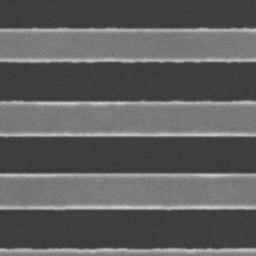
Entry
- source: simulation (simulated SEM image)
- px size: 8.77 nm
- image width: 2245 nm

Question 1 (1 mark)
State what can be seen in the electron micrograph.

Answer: lines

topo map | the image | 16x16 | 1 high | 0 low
0000000000000000
0000000000000000
1111111111111111
1111111111111111
0000000000000000
0000000000000000
1111111111111111
1111111111111111
0000000000000000
0000000000000000
0000000000000000
1111111111111111
1111111111111111
0000000000000000
0000000000000000
0000000000000000